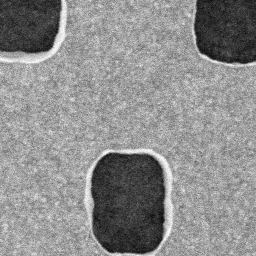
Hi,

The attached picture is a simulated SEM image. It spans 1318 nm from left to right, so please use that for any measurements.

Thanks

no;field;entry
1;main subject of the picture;holes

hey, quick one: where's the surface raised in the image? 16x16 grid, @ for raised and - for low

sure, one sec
----@@@@@@@@----
----@@@@@@@@----
---@@@@@@@@@----
--@@@@@@@@@@@---
@@@@@@@@@@@@@@@@
@@@@@@@@@@@@@@@@
@@@@@@@@@@@@@@@@
@@@@@@@@@@@@@@@@
@@@@@@@@@@@@@@@@
@@@@@@@@@@@@@@@@
@@@@@@----@@@@@@
@@@@@@----@@@@@@
@@@@@@----@@@@@@
@@@@@@----@@@@@@
@@@@@@----@@@@@@
@@@@@@----@@@@@@